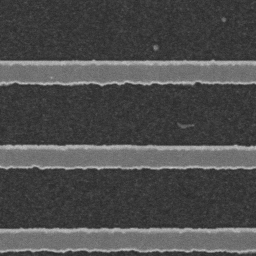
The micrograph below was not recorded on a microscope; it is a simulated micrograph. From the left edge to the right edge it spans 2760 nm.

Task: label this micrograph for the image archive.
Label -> lines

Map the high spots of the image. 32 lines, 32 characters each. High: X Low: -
--------------------------------
--------------------------------
--------------------------------
--------------------------------
--------------------------------
--------------------------------
--------------------------------
--------------------------------
XXXXXXXXXXXXXXXXXXXXXXXXXXXXXXXX
XXXXXXXXXXXXXXXXXXXXXXXXXXXXXXXX
-----X--X---X-----X-------------
--------------------------------
--------------------------------
--------------------------------
--------------------------------
--------------------------------
--------------------------------
--------------------------------
XXXXXXXXXXXXXXXXXXXXXXXXXXXXXXX-
XXXXXXXXXXXXXXXXXXXXXXXXXXXXXXXX
XXXXXXXXXXXXXXXXXXXXXXXXXXXXXXXX
--------------------------------
--------------------------------
--------------------------------
--------------------------------
--------------------------------
--------------------------------
--------------------------------
--------------------------------
XXXXXXXXXXXXXXXXXXXXXXXXXXXXXXXX
XXXXXXXXXXXXXXXXXXXXXXXXXXXXXXXX
--------------------------------